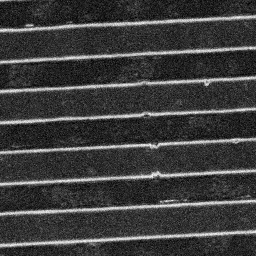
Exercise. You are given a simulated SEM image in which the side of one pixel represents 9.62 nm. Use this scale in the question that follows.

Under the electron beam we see one or a few lines or trenches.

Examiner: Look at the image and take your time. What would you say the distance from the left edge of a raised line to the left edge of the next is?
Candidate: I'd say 589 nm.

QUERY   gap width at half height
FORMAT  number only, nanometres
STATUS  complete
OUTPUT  287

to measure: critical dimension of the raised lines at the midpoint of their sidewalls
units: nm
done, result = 306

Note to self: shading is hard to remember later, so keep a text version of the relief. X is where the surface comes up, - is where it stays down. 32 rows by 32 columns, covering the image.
--------------------------------
--------------------------------
-------------------------XXXXXXX
------XXXXXXXXXXXXXXXXXXXXXXXXXX
XXXXXXXXXXXXXXXXXXXXXXXXXXXXXXXX
XXXXXXXXXXXXXXXXXXXXXXXXXXXXXXXX
XXXXXXXXXXXXXXXXXXXXXXX---------
XXXX----------------------------
--------------------------------
--------------------------------
-----------------XXXXXXXXXXXXXXX
XXXXXXXXXXXXXXXXXXXXXXXXXXXXXXXX
XXXXXXXXXXXXXXXXXXXXXXXXXXXXXXXX
XXXXXXXXXXXXXXXXXXXXXXXXXXXXXXXX
XXXXXXXXXXXXXXXX----------------
--------------------------------
--------------------------------
-----------------------------XXX
------------XXXXXXXXXXXXXXXXXXXX
XXXXXXXXXXXXXXXXXXXXXXXXXXXXXXXX
XXXXXXXXXXXXXXXXXXXXXXXXXXXXXXXX
XXXXXXXXXXXXXXXXXXXXXXXXXXXX----
XXXXXXXXXX----------------------
--------------------------------
--------------------------------
-------------------------XXXXXXX
----XXXXXXXXXXXXXXXXXXXXXXXXXXXX
XXXXXXXXXXXXXXXXXXXXXXXXXXXXXXXX
XXXXXXXXXXXXXXXXXXXXXXXXXXXXXXXX
XXXXXXXXXXXXXXXXXXXXXXX---------
XXXX----------------------------
--------------------------------